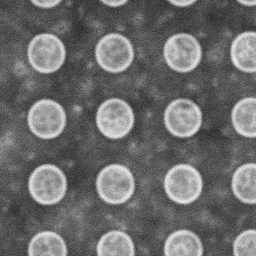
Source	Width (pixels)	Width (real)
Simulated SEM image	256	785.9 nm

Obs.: a regular array of raised bodies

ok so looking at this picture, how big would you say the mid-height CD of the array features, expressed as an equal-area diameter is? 108 nanometres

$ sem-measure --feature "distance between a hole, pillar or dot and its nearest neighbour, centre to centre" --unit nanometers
201